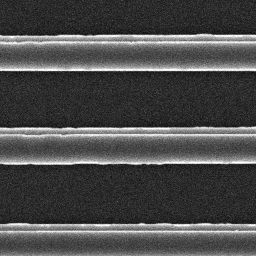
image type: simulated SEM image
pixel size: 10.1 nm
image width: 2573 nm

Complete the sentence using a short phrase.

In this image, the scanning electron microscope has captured lines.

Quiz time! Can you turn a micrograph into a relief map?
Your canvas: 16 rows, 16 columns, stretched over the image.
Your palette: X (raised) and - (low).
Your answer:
----------------
----------------
XXXXXXXXXXXXXXXX
XXXXXXXXXXXXXXXX
----------------
----------------
----------------
----------------
XXXXXXXXXXXXXXXX
XXXXXXXXXXXXXXXX
----------------
----------------
----------------
----------------
XXXXXXXXXXXXXXXX
XXXXXXXXXXXXXXXX